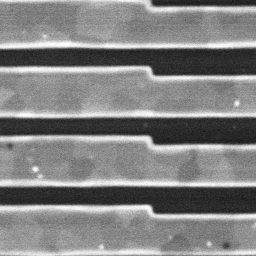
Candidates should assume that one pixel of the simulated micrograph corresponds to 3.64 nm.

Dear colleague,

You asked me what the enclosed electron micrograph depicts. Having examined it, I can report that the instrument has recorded wiring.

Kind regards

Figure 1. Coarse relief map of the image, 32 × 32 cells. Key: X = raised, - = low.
XXXXXXXXXXXXXXXXXXX-------------
XXXXXXXXXXXXXXXXXXXXXXXXXXXXXXXX
XXXXXXXXXXXXXXXXXXXXXXXXXXXXXXXX
XXXXXXXXXXXXXXXXXXXXXXXXXXXXXXXX
XXXXXXXXXXXXXXXXXXXXXXXXXXXXXXXX
XXXXXXXXXXXXXXXXXXXXXXXXXXXXXXXX
--------------------------------
--------------------------------
--------------------------------
XXXXXXXXXXXXXXXXXXX-------------
XXXXXXXXXXXXXXXXXXXXXXXXXXXXXXXX
XXXXXXXXXXXXXXXXXXXXXXXXXXXXXXXX
XXXXXXXXXXXXXXXXXXXXXXXXXXXXXXXX
XXXXXXXXXXXXXXXXXXXXXXXXXXXXXXXX
--------------------------------
--------------------------------
--------------------------------
XXXXXXXXXXXXXXXXXXX-------------
XXXXXXXXXXXXXXXXXXXXXXXXXXXXXXXX
XXXXXXXXXXXXXXXXXXXXXXXXXXXXXXXX
XXXXXXXXXXXXXXXXXXXXXXXXXXXXXXXX
XXXXXXXXXXXXXXXXXXXXXXXXXXXXXXXX
XXXXXXXXXXXXXXXXXXXXXXXXXXXXXXXX
--------------------------------
--------------------------------
--------------------------------
XXXXXXXXXXXXXXXXXXX-------------
XXXXXXXXXXXXXXXXXXXXXXXXXXXXXXXX
XXXXXXXXXXXXXXXXXXXXXXXXXXXXXXXX
XXXXXXXXXXXXXXXXXXXXXXXXXXXXXXXX
XXXXXXXXXXXXXXXXXXXXXXXXXXXXXXXX
XXXXXXXXXXXXXXXXXXXXXXXXXXXXXXXX